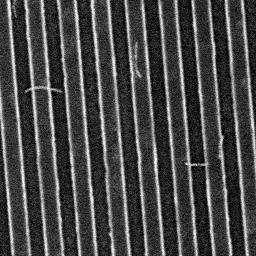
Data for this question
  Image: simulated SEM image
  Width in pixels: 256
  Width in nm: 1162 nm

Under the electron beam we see parallel lines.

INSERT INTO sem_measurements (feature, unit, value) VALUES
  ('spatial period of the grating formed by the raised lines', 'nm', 151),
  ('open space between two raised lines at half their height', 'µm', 0.0702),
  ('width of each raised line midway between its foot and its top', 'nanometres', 83.2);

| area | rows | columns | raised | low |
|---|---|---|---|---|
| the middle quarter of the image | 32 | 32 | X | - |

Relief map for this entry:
XXXX----XXXXX----XXXX----XXXX---
XXXX----XXXXX----XXXX----XXXXX--
XXXX-----XXXX----XXXX----XXXX---
XXXXX----XXXX----XXXX----XXXXX--
XXXXX----XXXX----XXXX----XXXXX--
XXXXX----XXXX----XXXX-----XXXX--
XXXXX----XXXX----XXXXX----XXXX--
XXXXX----XXXX----XXXXX----XXXX--
-XXXX----XXXX----XXXXX----XXXX--
-XXXX----XXXX----XXXXX----XXXX--
-XXXX----XXXX----XXXXX----XXXX--
-XXXX----XXXX-----XXXX----XXXX--
-XXXX----XXXXX----XXXX----XXXX--
-XXXX----XXXXX----XXXX----XXXX--
-XXXX-----XXXX----XXXX----XXXX--
-XXXXX---XXXXX----XXXX----XXXXX-
-XXXXX----XXXX----XXXX----XXXXX-
-XXXXX----XXXX----XXXX-----XXXX-
-XXXXX----XXXX----XXXXX---XXXXX-
-XXXXX----XXXX----XXXXX---XXXXX-
--XXXX----XXXX----XXXXX----XXXX-
--XXXX----XXXX----XXXXX----XXXX-
--XXXX----XXXX-----XXXX----XXXX-
--XXXX----XXXX-----XXXX----XXXX-
--XXXX----XXXXX----XXXX----XXXX-
--XXXX----XXXXX----XXXX----XXXXX
--XXXX-----XXXX----XXXX----XXXX-
--XXXXX----XXXX----XXXX----XXXXX
--XXXXX----XXXX----XXXX----XXXXX
--XXXXX----XXXX----XXXX-----XXXX
--XXXXX----XXXX----XXXXX----XXXX
--XXXXX----XXXX----XXXXX----XXXX